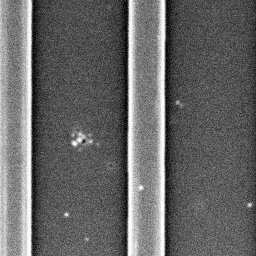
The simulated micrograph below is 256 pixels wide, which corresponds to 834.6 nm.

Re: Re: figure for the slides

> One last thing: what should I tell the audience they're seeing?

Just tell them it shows wiring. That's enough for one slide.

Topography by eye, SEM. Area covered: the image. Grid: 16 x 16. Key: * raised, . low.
**......**......
**......**......
**......**......
**......**......
**......**......
**......**......
**......**......
**......**......
**......**......
**......**......
**......**......
**......**......
**......**......
**......**......
**......**......
**......**......